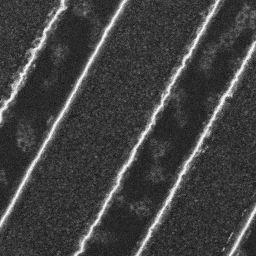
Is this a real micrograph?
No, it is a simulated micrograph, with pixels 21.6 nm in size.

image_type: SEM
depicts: one or a few lines or trenches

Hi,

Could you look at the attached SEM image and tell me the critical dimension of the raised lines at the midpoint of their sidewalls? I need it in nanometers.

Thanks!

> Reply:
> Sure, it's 1140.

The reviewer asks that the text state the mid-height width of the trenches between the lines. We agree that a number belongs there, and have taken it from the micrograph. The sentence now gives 1760 nm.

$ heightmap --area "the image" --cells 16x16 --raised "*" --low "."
....****.....***
...****......***
...***......****
..****......****
..***......****.
.****......***..
****......****..
****......***...
***......****...
***.....****....
**......****....
*......****.....
*......****.....
......****......
......***......*
.....****......*